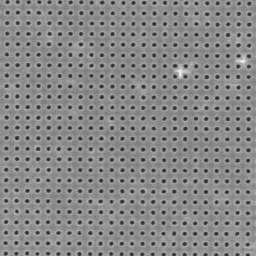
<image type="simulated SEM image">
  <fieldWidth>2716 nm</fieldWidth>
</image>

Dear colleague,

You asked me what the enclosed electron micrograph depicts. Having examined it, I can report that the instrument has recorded a regular array of holes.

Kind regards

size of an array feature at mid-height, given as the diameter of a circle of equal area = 0.0432 um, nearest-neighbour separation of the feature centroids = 108 nm